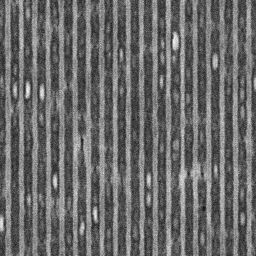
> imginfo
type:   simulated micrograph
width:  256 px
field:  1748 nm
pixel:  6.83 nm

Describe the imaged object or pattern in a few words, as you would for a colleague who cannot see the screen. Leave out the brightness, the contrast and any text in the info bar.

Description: parallel lines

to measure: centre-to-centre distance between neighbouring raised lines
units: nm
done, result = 91.5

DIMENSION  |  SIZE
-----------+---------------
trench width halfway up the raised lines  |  66.6 nanometers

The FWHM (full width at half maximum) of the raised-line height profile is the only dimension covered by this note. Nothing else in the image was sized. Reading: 3.88 px